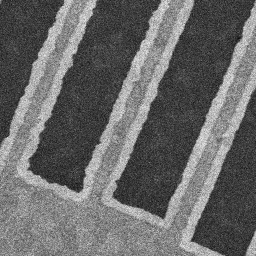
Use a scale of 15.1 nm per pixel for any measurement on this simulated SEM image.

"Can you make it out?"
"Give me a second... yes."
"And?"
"one or a few lines or trenches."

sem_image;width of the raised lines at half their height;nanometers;361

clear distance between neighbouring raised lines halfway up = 981 nanometers